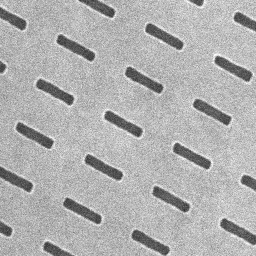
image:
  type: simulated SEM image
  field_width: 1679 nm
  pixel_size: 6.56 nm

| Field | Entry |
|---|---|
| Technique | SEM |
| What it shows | a regular array of holes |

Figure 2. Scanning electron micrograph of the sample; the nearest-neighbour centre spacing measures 317 nm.